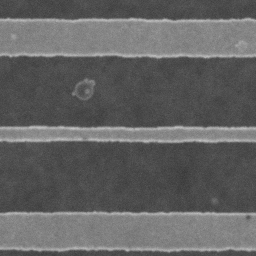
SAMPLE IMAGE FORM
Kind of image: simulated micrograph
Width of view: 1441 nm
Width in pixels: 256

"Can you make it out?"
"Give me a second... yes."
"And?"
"lines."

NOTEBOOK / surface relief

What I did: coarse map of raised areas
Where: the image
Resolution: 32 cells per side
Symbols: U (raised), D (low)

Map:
DDDDDDDDDDDDDDDDDDDDDDDDDDDDDDDD
DDDDDDDDDDDDDDDDDDDDDDDDDDDDDDDD
UUUUUUUUDDUUUUUUUUUDUDDDDDDDUUUU
UUUUUUUUUUUUUUUUUUUUUUUUUUUUUUUU
UUUUUUUUUUUUUUUUUUUUUUUUUUUUUUUU
UUUUUUUUUUUUUUUUUUUUUUUUUUUUUUUU
UUUUUUUUUUUUUUUUUUUUUUUUUUUUUUUU
DDDDDDDDDDDDDDDDDDDDDDDDDDDDDDDD
DDDDDDDDDDDDDDDDDDDDDDDDDDDDDDDD
DDDDDDDDDDDDDDDDDDDDDDDDDDDDDDDD
DDDDDDDDDDDDDDDDDDDDDDDDDDDDDDDD
DDDDDDDDDDUDDDDDDDDDDDDDDDDDDDDD
DDDDDDDDDDDDDDDDDDDDDDDDDDDDDDDD
DDDDDDDDDDDDDDDDDDDDDDDDDDDDDDDD
DDDDDDDDDDDDDDDDDDDDDDDDDDDDDDDD
DDDDDDDDDDDDDDDDDDDDDDDDDDDDDDDD
UUUUUUUUUUUUUUUUUUUUUUUUUUUUUUUU
UUUUUUUUUUUUUUUUUUUUUUUUUUUUUUUU
DDDDDDDDDDDDDDDDDDDDDDDDDDDDDDDD
DDDDDDDDDDDDDDDDDDDDDDDDDDDDDDDD
DDDDDDDDDDDDDDDDDDDDDDDDDDDDDDDD
DDDDDDDDDDDDDDDDDDDDDDDDDDDDDDDD
DDDDDDDDDDDDDDDDDDDDDDDDDDDDDDDD
DDDDDDDDDDDDDDDDDDDDDDDDDDDDDDDD
DDDDDDDDDDDDDDDDDDDDDDDDDDDDDDDD
DDDDDDDDDDDDDDDDDDDDDDDDDDDDDDDD
DDDDDDDDDDDUDDDDDDDDDDDDDDDDDDDD
UUUUUUUUUUUUUUUUUUUUUUUUUUUUUUUU
UUUUUUUUUUUUUUUUUUUUUUUUUUUUUUUU
UUUUUUUUUUUUUUUUUUUUUUUUUUUUUUUU
UUUUUUUUUUUUUUUUUUUUUUUUUUUUUUUU
DDDDDDDDDDDDDDDDDDDDDDDDDDDDDDDD